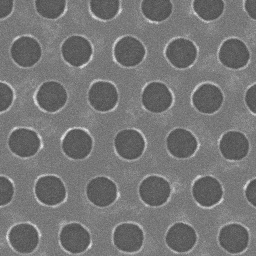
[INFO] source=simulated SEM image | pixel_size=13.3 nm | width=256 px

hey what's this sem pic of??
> a regular array of holes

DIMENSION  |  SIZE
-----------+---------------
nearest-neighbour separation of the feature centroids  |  686 nanometres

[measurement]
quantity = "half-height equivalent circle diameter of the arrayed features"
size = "414 nm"